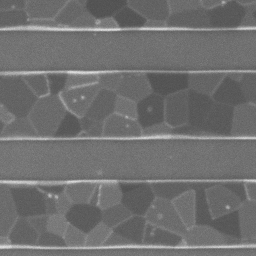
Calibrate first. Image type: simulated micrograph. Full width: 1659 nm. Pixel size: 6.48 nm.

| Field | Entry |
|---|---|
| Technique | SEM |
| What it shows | wiring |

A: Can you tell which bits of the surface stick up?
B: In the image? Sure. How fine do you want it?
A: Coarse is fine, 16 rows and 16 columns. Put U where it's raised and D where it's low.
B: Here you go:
UUUUUUUUUUUUUUUU
UUUUUUUUUUUUUUUU
DDDDDDDDDDDDDDDD
DDDDDDDDDDDDDDDD
DDDDDDUUUUUDUUUU
UUUUUUUUUUUUUUUU
UUUUUUUUUUUUUUUU
UUUUUUUUUUUUUUUU
UUUUUUUUUUUUUUUU
DDDDDDDDDDDDDDDD
DDDDDDDDDDDDDDDD
UUUUUUUUUUUUUUUU
UUUUUUUUUUUUUUUU
UUUUUUUUUUUUUUUU
UUUUUUUUUUUUUUUU
DDDDDDDDDDDDDDDD